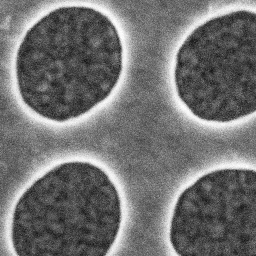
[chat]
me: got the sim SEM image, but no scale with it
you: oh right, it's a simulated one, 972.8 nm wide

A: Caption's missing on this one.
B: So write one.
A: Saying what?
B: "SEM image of holes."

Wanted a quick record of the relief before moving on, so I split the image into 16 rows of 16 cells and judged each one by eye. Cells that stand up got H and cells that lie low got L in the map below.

HHHHLLHHHHHHHHHH
HHLLLLLHHHHHHLLL
HLLLLLLLHHHHLLLL
HLLLLLLLHHHLLLLL
HLLLLLLLHHHLLLLL
HLLLLLLHHHHLLLLL
HHLLLLHHHHHLLLLL
HHHLHHHHHHHHHLLH
HHHHHHHHHHHHHHHH
HHHHHHHHHHHHHHHH
HHHLLLHHHHHHHHLH
HHLLLLLHHHHHLLLL
HLLLLLLLHHHLLLLL
HLLLLLLLHHHLLLLL
HLLLLLLHHHHLLLLL
HLLLLLLHHHHLLLLL